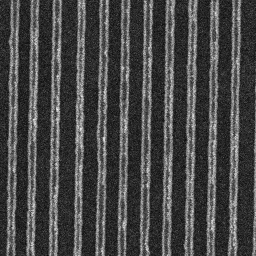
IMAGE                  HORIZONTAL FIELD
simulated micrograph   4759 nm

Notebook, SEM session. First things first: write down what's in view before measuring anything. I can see parallel lines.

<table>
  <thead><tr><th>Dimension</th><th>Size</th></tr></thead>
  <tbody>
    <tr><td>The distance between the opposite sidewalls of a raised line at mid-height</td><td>125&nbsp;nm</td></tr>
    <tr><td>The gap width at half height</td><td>15.4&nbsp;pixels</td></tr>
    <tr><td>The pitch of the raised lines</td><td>22.2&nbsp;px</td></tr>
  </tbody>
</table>